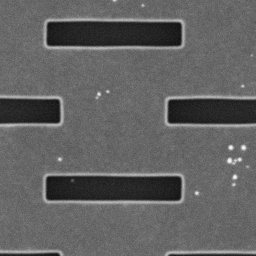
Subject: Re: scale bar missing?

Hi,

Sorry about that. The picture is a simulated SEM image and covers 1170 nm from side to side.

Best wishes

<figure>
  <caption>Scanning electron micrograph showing groups of lines, slits or small figures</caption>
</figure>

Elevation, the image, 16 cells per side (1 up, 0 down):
1111111111111111
1110000000011111
1110000000011111
1111111111111111
1111111111111111
1111111111111111
0000111111100000
0000111111100000
1111111111111111
1111111111111111
1111111111111111
1110000000011111
1110000000011111
1111111111111111
1111111111111111
1111111111111111